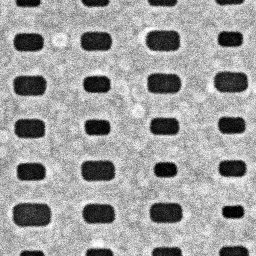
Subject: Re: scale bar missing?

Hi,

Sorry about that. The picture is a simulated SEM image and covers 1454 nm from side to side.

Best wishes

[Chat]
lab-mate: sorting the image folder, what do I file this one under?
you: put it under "a regular array of holes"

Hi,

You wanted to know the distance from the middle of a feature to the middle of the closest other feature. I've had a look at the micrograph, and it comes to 244 nm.